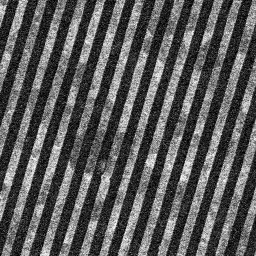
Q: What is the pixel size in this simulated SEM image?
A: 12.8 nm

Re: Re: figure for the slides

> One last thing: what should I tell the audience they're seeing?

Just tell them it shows parallel lines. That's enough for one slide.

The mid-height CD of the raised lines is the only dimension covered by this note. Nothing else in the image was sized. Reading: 102 nm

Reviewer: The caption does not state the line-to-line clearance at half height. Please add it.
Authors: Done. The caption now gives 134 nm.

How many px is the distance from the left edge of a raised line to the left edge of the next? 18.6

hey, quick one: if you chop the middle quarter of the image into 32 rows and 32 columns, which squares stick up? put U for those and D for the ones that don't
UDDUUDDDUUDDDUUDDDUUDDDUUDDDUUDD
DDDUUDDDUUDDDUUDDDUUDDDUUDDUUUDD
DDDUUDDDUUDDDUUDDUUUDDUUDDDUUDDD
DDUUDDDUUDDDUUDDDUUDDDUUDDDUUDDD
DDUUDDDUUDDDUUDDDUUDDDUUDDUUUDDD
DDUUDDDUUDDDUUDDDUUDDDUDDDUUDDDU
DDUUDDUUUDDUUUDDUUDDDUUDDDUUDDDU
DUUDDDUUDDDUUDDDUUDDDUUDDDUUDDDU
DUUDDDUUDDDUUDDDUUDDUUUDDUUDDDUU
DUUDDDUUDDUUUDDDUDDDUUDDDUUDDDUU
UUDDDUUDDDUUDDDUUDDDUUDDDUUDDDUU
UUDDDUUDDDUUDDDUUDDDUUDDUUDDDDUD
UUDDDUUDDUUUDDUUUDDUUDDDUUDDDUUD
UDDDUUDDDUUDDDUUDDDUUDDDUUDDDUUD
UDDDUUDDDUUDDDUUDDDUUDDUUUDDUUUD
UDDDUUDDDUUDDDUUDDDUDDDUUDDDUUDD
UDDUUUDDUUUDDUUDDDUUDDDUUDDDUUDD
DDDUUDDDUUDDDUUDDDUUDDDUUDDUUUDD
DDDUUDDDUUDDDUUDDDUUDDUUDDDUUDDD
DDDUDDDUUUDDUUDDDUUDDDUUDDDUUDDD
DDUUDDDUUDDDUUDDDUUDDDUUDDUUUDDU
DDUUDDDUUDDDUUDDDUUDDUUDDDUUDDDU
DDUUDDUUUDDUUUDDUUDDDUUDDDUUDDDU
DDUDDDUUDDDUUDDDUUDDDUUDDDUUDDDU
DUUDDDUUDUUUUDDDUUDDUUUDDUUUDDUU
DUUDDDUUDUUUUDDDUDDDUUDDDUUDDDUU
UUUDDUUDDUUUDDDUUDDDUUDDDUUDDDUU
UUDDDUUDDDUUDDDUUDDDUUDDDUUDDUUD
UUDDDUUDDUUDDDDUUDDUUDDDUUDDDUUD
UUDDUUDDDUUDDDUUDDDUUDDDUUDDDUUD
UDDDUUDDDUUDDDUUDDDUUDDDUUDDUUUD
UDDDUUDDDUUDDDUUDDUUDDDUUDDDUUDD